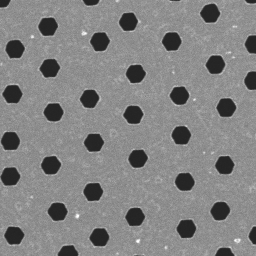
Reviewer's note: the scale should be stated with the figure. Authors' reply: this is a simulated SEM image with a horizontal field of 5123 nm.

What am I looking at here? a regular array of holes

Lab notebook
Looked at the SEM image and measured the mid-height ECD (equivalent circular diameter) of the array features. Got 384 nm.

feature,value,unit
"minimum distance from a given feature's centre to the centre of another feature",818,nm